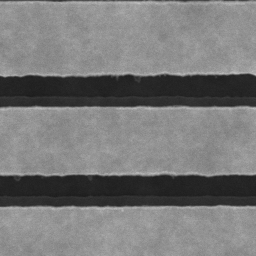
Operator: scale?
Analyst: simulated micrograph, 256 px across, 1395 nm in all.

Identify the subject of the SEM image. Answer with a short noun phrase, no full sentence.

lines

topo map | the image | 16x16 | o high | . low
oooooooooooooooo
oooooooooooooooo
oooooooooooooooo
oooooooooooooooo
oooooooooooooooo
................
................
oooooooooooooooo
oooooooooooooooo
oooooooooooooooo
oooooooooooooooo
................
................
oooooooooooooooo
oooooooooooooooo
oooooooooooooooo